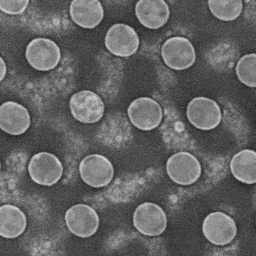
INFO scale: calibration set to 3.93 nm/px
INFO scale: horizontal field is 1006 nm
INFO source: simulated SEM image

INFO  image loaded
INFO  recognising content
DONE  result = a regular array of raised bodies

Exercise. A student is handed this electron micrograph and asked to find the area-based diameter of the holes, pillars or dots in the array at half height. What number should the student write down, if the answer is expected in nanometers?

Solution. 129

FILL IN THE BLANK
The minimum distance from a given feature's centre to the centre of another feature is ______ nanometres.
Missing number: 230